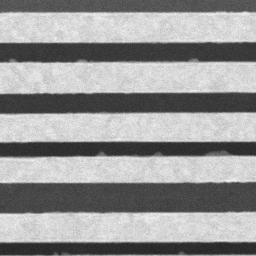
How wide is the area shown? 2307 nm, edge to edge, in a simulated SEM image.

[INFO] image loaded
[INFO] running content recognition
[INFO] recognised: lines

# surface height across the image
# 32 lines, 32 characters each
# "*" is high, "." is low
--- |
................................
................................
********************************
********************************
********************************
................................
................................
................................
********************************
********************************
********************************
****************************.***
................................
................................
********************************
********************************
********************************
********************************
................................
................................
********************************
********************************
********************************
................................
................................
................................
................................
********************************
********************************
********************************
................................
................................